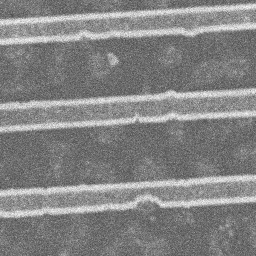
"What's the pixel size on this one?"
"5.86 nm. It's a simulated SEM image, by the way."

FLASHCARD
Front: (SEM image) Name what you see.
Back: one or a few lines or trenches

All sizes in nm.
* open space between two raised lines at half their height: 380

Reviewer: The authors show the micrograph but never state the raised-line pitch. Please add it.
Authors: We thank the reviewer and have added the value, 502 nanometers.